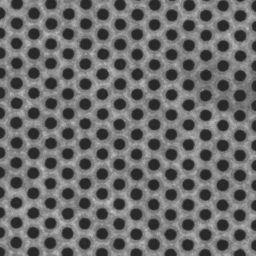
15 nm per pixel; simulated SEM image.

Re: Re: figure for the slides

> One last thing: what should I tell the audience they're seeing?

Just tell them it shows a regular array of holes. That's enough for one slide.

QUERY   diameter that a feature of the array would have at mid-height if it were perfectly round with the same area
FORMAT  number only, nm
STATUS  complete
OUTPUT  184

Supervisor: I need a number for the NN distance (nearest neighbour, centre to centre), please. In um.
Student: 0.293